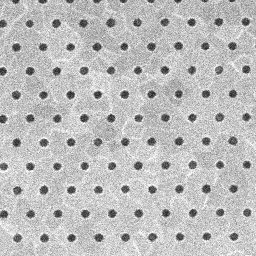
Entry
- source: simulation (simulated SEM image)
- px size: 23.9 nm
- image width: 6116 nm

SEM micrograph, a regular array of holes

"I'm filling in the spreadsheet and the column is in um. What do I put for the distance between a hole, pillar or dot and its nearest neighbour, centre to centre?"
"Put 0.639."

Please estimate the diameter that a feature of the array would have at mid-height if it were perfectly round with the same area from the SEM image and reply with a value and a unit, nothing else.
0.229 um